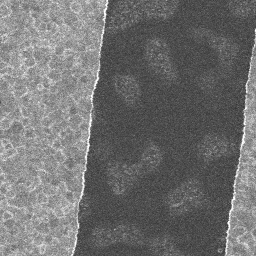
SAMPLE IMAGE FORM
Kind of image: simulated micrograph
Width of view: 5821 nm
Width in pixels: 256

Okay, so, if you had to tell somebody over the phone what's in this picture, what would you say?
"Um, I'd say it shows one or a few lines or trenches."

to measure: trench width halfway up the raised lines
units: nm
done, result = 3440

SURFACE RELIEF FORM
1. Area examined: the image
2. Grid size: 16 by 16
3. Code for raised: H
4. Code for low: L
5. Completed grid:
HHHHHHHLLLLLLLLL
HHHHHHLLLLLLLLLL
HHHHHHLLLLLLLLLL
HHHHHHLLLLLLLLLL
HHHHHHLLLLLLLLLL
HHHHHHLLLLLLLLLH
HHHHHHLLLLLLLLLH
HHHHHHLLLLLLLLLH
HHHHHHLLLLLLLLLH
HHHHHLLLLLLLLLLH
HHHHHLLLLLLLLLLH
HHHHHLLLLLLLLLLH
HHHHHLLLLLLLLLLH
HHHHHLLLLLLLLLHH
HHHHHLLLLLLLLLHH
HHHHHLLLLLLLLLHH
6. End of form